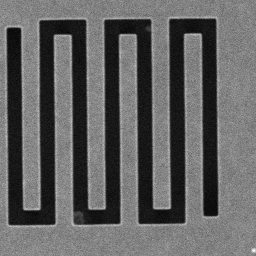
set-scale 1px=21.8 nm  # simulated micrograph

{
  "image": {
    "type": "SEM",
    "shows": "groups of lines, slits or small figures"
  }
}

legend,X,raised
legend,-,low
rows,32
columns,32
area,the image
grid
XXXXXXXXXXXXXXXXXXXXXXXXXXXXXXXX
XXXXXXXXXXXXXXXXXXXXXXXXXXXXXXXX
XXXXX-----XXX------XX------XXXXX
X-XXX------XX------XX------XXXXX
X--XX--XX--XX--XX--XX--XX--XXXXX
X--XX--XX--XX--XX--XX--XX--XXXXX
X--XX--XX--XX--XX--XX--XX--XXXXX
X--XX--XX--XX--XX--XX--XX--XXXXX
X--XX--XX--XX--XX--XX--XX--XXXXX
X--XX--XX--XX--XX--XX--XX--XXXXX
X--XX--XX--XX--XX--XX--XX--XXXXX
X--XX--XX--XX--XX--XX--XX--XXXXX
X--XX--XX--XX--XX--XX--XX--XXXXX
X--XX--XX--XX--XX--XX--XX--XXXXX
X--XX--XX--XX--XX--XX--XX--XXXXX
X--XX--XX--XX--XX--XX--XX--XXXXX
X--XX--XX--XX--XX--XX--XX--XXXXX
X--XX--XX--XX--XX--XX--XX--XXXXX
X--XX--XX--XX--XX--XX--XX--XXXXX
X--XX--XX--XX--XX--XX--XX--XXXXX
X--XX--XX--XX--XX--XX--XX--XXXXX
X--XX--XX--XX--XX--XX--XX--XXXXX
X--XX--XX--XX--XX--XX--XX--XXXXX
X--XX--XX--XX--XX--XX--XX--XXXXX
X--XX--XX--XX--XX--XX--XX--XXXXX
X--XX--XX--XX--XX--XX--XX--XXXXX
X------XX------XX------XX--XXXXX
X------XX------XX------XXXXXXXXX
XXXXXXXXXXXXXXXXXXXXXXXXXXXXXXXX
XXXXXXXXXXXXXXXXXXXXXXXXXXXXXXXX
XXXXXXXXXXXXXXXXXXXXXXXXXXXXXXXX
XXXXXXXXXXXXXXXXXXXXXXXXXXXXXXXX